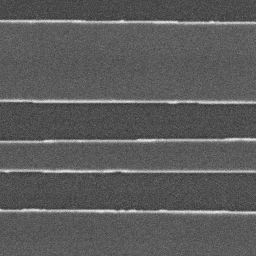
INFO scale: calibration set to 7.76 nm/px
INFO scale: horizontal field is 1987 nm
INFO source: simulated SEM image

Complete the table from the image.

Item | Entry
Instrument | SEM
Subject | lines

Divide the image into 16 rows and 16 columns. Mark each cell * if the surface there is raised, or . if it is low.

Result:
................
****************
****************
****************
****************
****************
................
................
................
****************
****************
................
................
****************
****************
****************